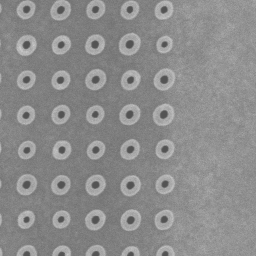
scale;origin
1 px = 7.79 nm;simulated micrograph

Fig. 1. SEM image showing a regular array of ring-shaped raised bodies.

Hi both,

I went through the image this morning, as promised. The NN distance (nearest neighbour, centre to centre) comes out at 266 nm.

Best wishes